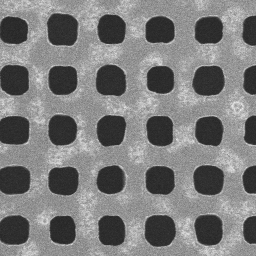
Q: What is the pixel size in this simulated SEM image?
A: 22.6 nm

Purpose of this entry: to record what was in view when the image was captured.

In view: a regular array of holes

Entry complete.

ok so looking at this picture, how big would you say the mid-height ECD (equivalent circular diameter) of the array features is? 694 nm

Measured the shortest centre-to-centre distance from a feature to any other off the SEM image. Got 1100 nanometres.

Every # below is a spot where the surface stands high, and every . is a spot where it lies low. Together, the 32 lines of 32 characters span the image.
################################
################################
...###....##...####..####...###.
...###....##....##....##....##..
...###....##....##....##....##..
#.#####..####..################.
################################
################################
...####..####..####..####...###.
....##....##....##....##....###.
....##....##....##....##....##..
#..####..###....###..###....###.
################################
################################
#######.#####..####.###########.
....##....##....##....###...###.
....##....##....##....##....###.
....##...###...####...###...###.
################################
################################
################################
....##....##...###....##....###.
....##....##....##....##....##..
....##....##...###....##....###.
################################
################################
################################
...###...####..###....###...###.
....##....##....##....##....##..
....##...###....##....###...##..
#..##########..####..####..####.
################################